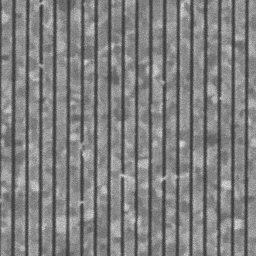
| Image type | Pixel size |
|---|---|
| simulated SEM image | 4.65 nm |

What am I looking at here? parallel lines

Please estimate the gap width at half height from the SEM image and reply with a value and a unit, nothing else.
0.018 um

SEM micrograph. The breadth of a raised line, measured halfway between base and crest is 44.7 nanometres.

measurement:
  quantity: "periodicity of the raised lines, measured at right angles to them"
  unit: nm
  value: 63.8